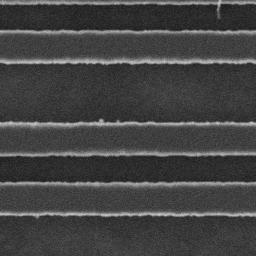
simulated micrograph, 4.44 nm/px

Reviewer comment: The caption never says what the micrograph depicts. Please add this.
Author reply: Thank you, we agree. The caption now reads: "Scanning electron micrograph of lines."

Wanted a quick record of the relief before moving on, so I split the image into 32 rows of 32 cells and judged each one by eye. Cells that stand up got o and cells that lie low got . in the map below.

ooooo.oooooooooooooooooooooo.ooo
................................
................................
................................
oooooooooooooooooooooooooooooooo
oooooooooooooooooooooooooooooooo
oooooooooooooooooooooooooooooooo
oooooooooooooooooooooooooooooooo
................................
................................
................................
................................
................................
................................
................................
oooooooooooooooooooooooooooooooo
oooooooooooooooooooooooooooooooo
oooooooooooooooooooooooooooooooo
oooooooooooooooooooooooooooooooo
................................
................................
................................
................................
oooooooooooooooooooooooooooooooo
oooooooooooooooooooooooooooooooo
oooooooooooooooooooooooooooooooo
oooooooooooooooooooooooooooooooo
................................
................................
................................
................................
................................